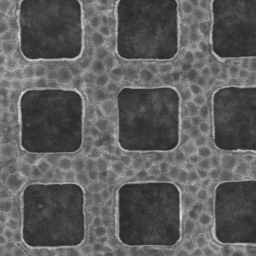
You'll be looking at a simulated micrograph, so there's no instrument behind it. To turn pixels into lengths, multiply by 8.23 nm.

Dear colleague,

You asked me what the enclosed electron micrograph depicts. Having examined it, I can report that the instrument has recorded holes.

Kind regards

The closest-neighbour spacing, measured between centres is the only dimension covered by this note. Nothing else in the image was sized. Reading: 782 nm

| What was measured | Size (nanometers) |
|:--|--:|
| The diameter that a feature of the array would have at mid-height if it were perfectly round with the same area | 567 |